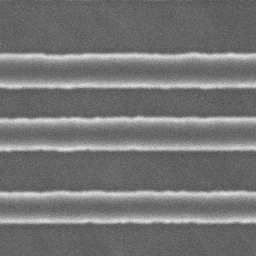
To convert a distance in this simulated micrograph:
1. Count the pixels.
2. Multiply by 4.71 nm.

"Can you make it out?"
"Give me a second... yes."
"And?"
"lines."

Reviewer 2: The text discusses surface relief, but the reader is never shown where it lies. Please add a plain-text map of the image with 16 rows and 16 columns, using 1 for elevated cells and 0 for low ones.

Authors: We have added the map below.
0000000000000000
0000000000000000
0000000000000000
1111111111111111
1111111111111111
0000000000000000
0000000000000000
1111111111111111
1111111111111111
0000000000000000
0000000000000000
0000000000000000
1111111111111111
1111111111111111
0000000000000000
0000000000000000